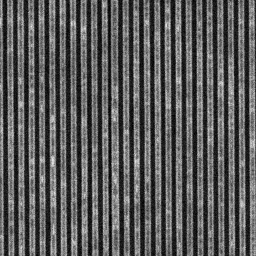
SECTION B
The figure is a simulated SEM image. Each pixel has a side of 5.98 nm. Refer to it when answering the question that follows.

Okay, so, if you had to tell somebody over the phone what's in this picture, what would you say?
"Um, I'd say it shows parallel lines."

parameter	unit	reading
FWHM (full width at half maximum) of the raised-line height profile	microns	0.0306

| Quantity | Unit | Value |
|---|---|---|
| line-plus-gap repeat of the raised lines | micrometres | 0.0629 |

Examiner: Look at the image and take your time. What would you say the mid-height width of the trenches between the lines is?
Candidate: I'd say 30.6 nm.